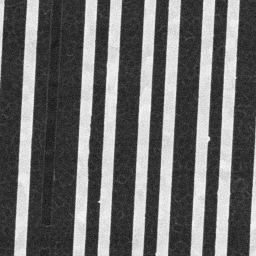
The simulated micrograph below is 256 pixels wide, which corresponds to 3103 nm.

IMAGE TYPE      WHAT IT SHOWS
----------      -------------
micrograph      parallel lines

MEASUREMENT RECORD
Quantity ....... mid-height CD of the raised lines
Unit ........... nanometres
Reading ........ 133